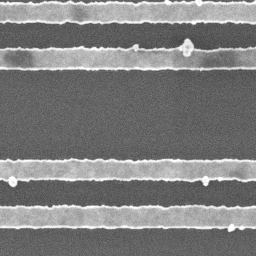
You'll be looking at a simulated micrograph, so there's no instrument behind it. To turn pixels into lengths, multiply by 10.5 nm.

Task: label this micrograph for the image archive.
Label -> lines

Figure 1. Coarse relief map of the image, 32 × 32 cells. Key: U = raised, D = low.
UUUUUUUUUUUUUUUUUUUUUUUUUUUUUUUU
UUUUUUUUUUUUUUUUUUUUUUUUUUUUUUUU
UUUUUUUUUUUUUUUUUUUUUUUUUUUUUUUU
DDDDDDDDDDDDDDDDDDDDDDDDDDDDDDDD
DDDDDDDDDDDDDDDDDDDDDDDDDDDDDDDD
DDDDDDDDDDDDDDDDDDDDDDDUDDDDDDDD
UUUUUUUUUUUUUUUUUUUUUUUUUUUUUUUU
UUUUUUUUUUUUUUUUUUUUUUUUUUUUUUUU
UUUUUUUUUUUUUUUUUUUUUUUUUUUUUUUU
DDDDDDDDDDDDDDDDDDDDDDDDDDDDDDDD
DDDDDDDDDDDDDDDDDDDDDDDDDDDDDDDD
DDDDDDDDDDDDDDDDDDDDDDDDDDDDDDDD
DDDDDDDDDDDDDDDDDDDDDDDDDDDDDDDD
DDDDDDDDDDDDDDDDDDDDDDDDDDDDDDDD
DDDDDDDDDDDDDDDDDDDDDDDDDDDDDDDD
DDDDDDDDDDDDDDDDDDDDDDDDDDDDDDDD
DDDDDDDDDDDDDDDDDDDDDDDDDDDDDDDD
DDDDDDDDDDDDDDDDDDDDDDDDDDDDDDDD
DDDDDDDDDDDDDDDDDDDDDDDDDDDDDDDD
DDDDDDDDDDDDDDDDDDDDDDDDDDDDDDDD
UUUUUUUUUUUUUUUUUUUUUUUUUUUUUUUU
UUUUUUUUUUUUUUUUUUUUUUUUUUUUUUUU
UUUUDDDDUUDDUDDUDDDUUUUUUUUDDDUU
DDDDDDDDDDDDDDDDDDDDDDDDDDDDDDDD
DDDDDDDDDDDDDDDDDDDDDDDDDDDDDDDD
DDDDDDDDDDDDDDDDDDDDDDDDDDDDDDDD
UUUUUUUUUUUUUUUUUUUUUUUUUUUUUUUU
UUUUUUUUUUUUUUUUUUUUUUUUUUUUUUUU
DDUDUDDDDUDDDUUDUUDDUDDDUUUUUUUU
DDDDDDDDDDDDDDDDDDDDDDDDDDDDDDDD
DDDDDDDDDDDDDDDDDDDDDDDDDDDDDDDD
DDDDDDDDDDDDDDDDDDDDDDDDDDDDDDDD